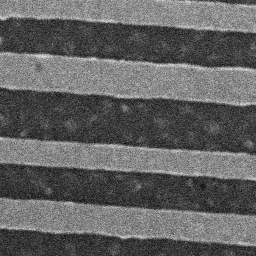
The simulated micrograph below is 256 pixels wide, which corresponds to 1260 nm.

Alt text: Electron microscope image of one or a few lines or trenches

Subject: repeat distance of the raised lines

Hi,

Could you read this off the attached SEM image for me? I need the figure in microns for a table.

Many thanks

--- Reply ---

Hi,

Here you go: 0.349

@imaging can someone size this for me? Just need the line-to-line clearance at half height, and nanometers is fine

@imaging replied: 185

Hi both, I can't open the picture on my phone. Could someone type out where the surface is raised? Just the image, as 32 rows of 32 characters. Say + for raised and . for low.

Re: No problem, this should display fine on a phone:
+++++++++++++++++++++++++++++...
++++++++++++++++++++++++++++++++
...........+++++++++++++++++++++
.......................+++++++++
................................
................................
................................
+++++++++++++...................
+++++++++++++++++++++++++.......
++++++++++++++++++++++++++++++++
++++++++++++++++++++++++++++++++
.........+++++++++++++++++++++++
........................++++++++
................................
................................
................................
................................
++++............................
++++++++++++++++++..............
++++++++++++++++++++++++++++++++
....++++++++++++++++++++++++++++
....................++++++++++++
................................
................................
................................
+++++++++++.....................
++++++++++++++++++++++++........
++++++++++++++++++++++++++++++++
++++++++++++++++++++++++++++++++
...............+++++++++++++++++
.............................+++
................................